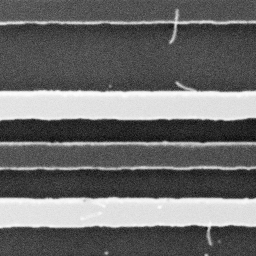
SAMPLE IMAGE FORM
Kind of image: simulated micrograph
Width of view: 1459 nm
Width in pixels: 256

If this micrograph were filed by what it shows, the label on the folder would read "lines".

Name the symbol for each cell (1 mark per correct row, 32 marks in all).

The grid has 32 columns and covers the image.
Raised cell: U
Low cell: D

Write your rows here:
UUUUUUUUUUUUUUUUUUUUUUUUUUUUUUUU
UUUUUUUUUUUUUUUUUUUUUUUUUUUUUUUU
UUUUUUUUUUUUUUUUUUUUUUUUUUUUUUUU
DDDDDDDDDDDDDDDDDDDDDDDDDDDDDDDD
DDDDDDDDDDDDDDDDDDDDDDDDDDDDDDDD
DDDDDDDDDDDDDDDDDDDDDDDDDDDDDDDD
DDDDDDDDDDDDDDDDDDDDDDDDDDDDDDDD
DDDDDDDDDDDDDDDDDDDDDDDDDDDDDDDD
DDDDDDDDDDDDDDDDDDDDDDDDDDDDDDDD
DDDDDDDDDDDDDDDDDDDDDDDDDDDDDDDD
DDDDDDDDDDDDDDDDDDDDDDDDDDDDDDDD
DDDDDDDDDDDDDDDDDDDDDDDDDDDDDDDD
UUUUUUUUUUUUUUUUUUUUUUUUUUUUUUUU
UUUUUUUUUUUUUUUUUUUUUUUUUUUUUUUU
UUUUUUUUUUUUUUUUUUUUUUUUUUUUUUUU
DDDDDDDDDDDDDDDDDDDDDDDDDDDDDDDD
DDDDDDDDDDDDDDDDDDDDDDDDDDDDDDDD
DDDDDDDDDDDDDDDDDDDDDDDDDDDDDDDD
UUUUUUUUUUUUUUUUUUUUUUUUUUUUUUUU
UUUUUUUUUUUUUUUUUUUUUUUUUUUUUUUU
UUUUUUUUUUUUUUUUUUUUUUUUUUUUUUUU
DDDDDDDDDDDDDDDDDDDDDDDDDDDDDDDD
DDDDDDDDDDDDDDDDDDDDDDDDDDDDDDDD
DDDDDDDDDDDDDDDDDDDDDDDDDDDDDDDD
DDDDDDDDDDDDDDDDDDDDDDDDDDDDDDDD
UUUUUUUUUUUUUUUUUUUUUUUUUUUUUUUU
UUUUUUUUUUUUUUUUUUUUUUUUUUUUUUUU
UUUUUUUUUUUUUUUUUUUUUUUUUUUUUUUU
DDDDDDDDDDDDDDDDDDDDDDDDDDDDDDDD
DDDDDDDDDDDDDDDDDDDDDDDDDDDDDDDD
DDDDDDDDDDDDDDDDDDDDDDDDDDDDDDDD
DDDDDDDDDDDDDDDDDDDDDDDDDDDDDDDD